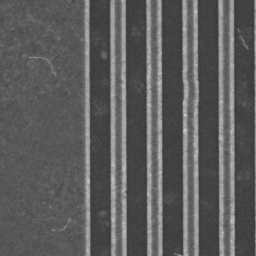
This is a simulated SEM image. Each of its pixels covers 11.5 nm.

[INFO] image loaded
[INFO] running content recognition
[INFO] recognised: parallel lines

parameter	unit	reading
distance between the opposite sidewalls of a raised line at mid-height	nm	135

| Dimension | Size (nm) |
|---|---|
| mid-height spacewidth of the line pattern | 281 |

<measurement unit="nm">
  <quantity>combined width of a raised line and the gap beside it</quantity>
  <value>415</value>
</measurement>